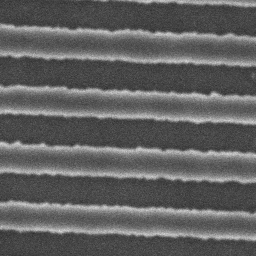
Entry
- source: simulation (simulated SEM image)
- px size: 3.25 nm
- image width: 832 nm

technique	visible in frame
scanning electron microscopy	lines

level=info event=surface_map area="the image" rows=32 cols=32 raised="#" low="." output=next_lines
........................########
................................
................................
######..........................
###########################.##..
################################
################################
................################
................................
................................
................................
################.#..............
################################
################################
............####################
................................
................................
................................
############.#..................
################################
################################
..##############################
.......................##.######
................................
................................
####.#..........................
###########################.....
################################
################################
..................#..#.#########
................................
................................